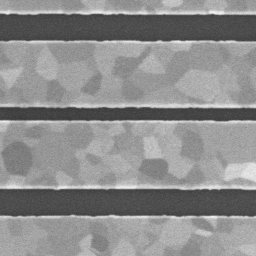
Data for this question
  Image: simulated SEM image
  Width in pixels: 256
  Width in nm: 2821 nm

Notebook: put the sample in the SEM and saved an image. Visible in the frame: lines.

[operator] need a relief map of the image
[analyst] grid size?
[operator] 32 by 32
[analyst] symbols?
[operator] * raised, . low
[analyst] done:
********************************
********************************
................................
................................
................................
********************************
********************************
********************************
********************************
********************************
********************************
********************************
********************************
................................
................................
********************************
********************************
********************************
********************************
********************************
********************************
********************************
********************************
********************************
................................
................................
................................
********************************
********************************
********************************
********************************
********************************